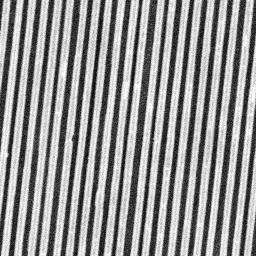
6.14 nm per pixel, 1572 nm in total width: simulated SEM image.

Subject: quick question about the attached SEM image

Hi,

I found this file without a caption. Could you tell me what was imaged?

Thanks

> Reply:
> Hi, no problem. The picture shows parallel lines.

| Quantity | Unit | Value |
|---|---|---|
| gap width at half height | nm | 42.7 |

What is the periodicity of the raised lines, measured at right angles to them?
78 nanometers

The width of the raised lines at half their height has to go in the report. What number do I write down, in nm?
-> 36.6